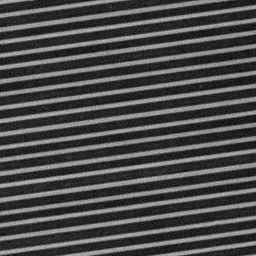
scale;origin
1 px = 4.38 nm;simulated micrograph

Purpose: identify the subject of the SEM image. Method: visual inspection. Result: parallel lines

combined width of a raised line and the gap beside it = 57 nm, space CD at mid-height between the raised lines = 41.2 nm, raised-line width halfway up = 15.2 nm